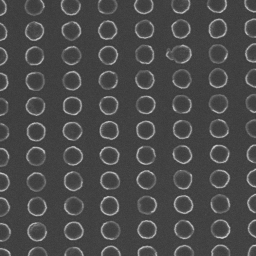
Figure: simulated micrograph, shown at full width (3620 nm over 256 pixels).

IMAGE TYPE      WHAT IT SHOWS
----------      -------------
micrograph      a regular array of raised bodies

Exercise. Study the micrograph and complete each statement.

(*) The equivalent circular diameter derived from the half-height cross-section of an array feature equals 19.1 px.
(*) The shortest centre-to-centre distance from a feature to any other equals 0.352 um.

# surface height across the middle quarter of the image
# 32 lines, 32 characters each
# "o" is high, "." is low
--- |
................................
.............................o..
.oo.......ooo......ooo......ooo.
oooo.....oooo.....oooo.....ooooo
oooo.....oooo.....oooo.....ooooo
oooo.....oooo......ooo......ooo.
................................
................................
.oo.......oo.......ooo......ooo.
oooo.....oooo.....ooooo....ooooo
oooo.....oooo.....ooooo....ooooo
oooo.....oooo......ooo......ooo.
.oo.......oo....................
................................
..........oo........oo......ooo.
oooo.....oooo.....oooo.....ooooo
oooo.....ooooo....ooooo....ooooo
oooo.....ooooo....oooo......oooo
.ooo......ooo......oo........oo.
................................
.............................o..
.ooo......ooo......ooo......ooo.
oooo.....ooooo....ooooo....ooooo
oooo.....ooooo....ooooo.....oooo
.ooo......ooo......ooo.......oo.
................................
................................
.ooo......ooo......ooo......oooo
oooo.....ooooo....ooooo.....oooo
ooooo....ooooo....ooooo.....oooo
oooo......oooo.....ooo......ooo.
..o.............................